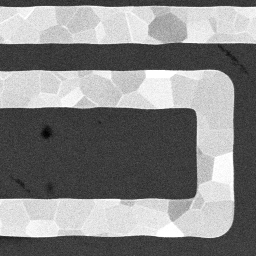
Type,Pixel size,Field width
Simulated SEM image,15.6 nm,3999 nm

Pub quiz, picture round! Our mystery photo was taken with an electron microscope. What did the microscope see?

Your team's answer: groups of lines, slits or small figures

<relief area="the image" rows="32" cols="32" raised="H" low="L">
LLLLLLLLLLLLLLLLLLLLLLLLLLLLLLLL
HHHHHHHHHHHHHHHHHHHHHHHHHHHHHHHH
HHHHHHHHHHHHHHHHHHHHHHHHHHHHHHHH
HHHHHHHHHHHHHHHHHHHHHHHHHHHHHHHH
HHHHHHHHHHHHHHHHHHHHHHHHHHHHHHHH
LLLLLLLLLLLLLLLLLLLLLLLLLLLLLLLL
LLLLLLLLLLLLLLLLLLLLLLLLLLLLLLLL
LLLLLLLLLLLLLLLLLLLLLLLLLLLLLLLL
LLLLLLLLLLLLLLLLLLLLLLLLLLLLLLLL
HHHHHHHHHHHHHHHHHHHHHHHHHHHHLLLL
HHHHHHHHHHHHHHHHHHHHHHHHHHHHHLLL
HHHHHHHHHHHHHHHHHHHHHHHHHHHHHLLL
HHHHHHHHHHHHHHHHHHHHHHHHHHHHHLLL
LLLLLLLLLLLLLLLLLHHHHLLLHHHHHLLL
LLLLLLLLLLLLLLLLLLLLLLLLLHHHHLLL
LLLLLLLLLLLLLLLLLLLLLLLLLHHHHLLL
LLLLLLLLLLLLLLLLLLLLLLLLLHHHHLLL
LLLLLLLLLLLLLLLLLLLLLLLLLHHHHLLL
LLLLLLLLLLLLLLLLLLLLLLLLLHHHHLLL
LLLLLLLLLLLLLLLLLLLLLLLLLHHHHLLL
LLLLLLLLLLLLLLLLLLLLLLLLLHHHHLLL
LLLLLLLLLLLLLLLLLLLLLLLLLHHHHLLL
LLLLLLLLLLLLLLLLLLLLLLLLLHHHHLLL
LLLLLLLLLLLLLLLLLLLLLLLLLHHHHLLL
LLLLLLLLLLLLLLLLLLLLLLLLHHHHHLLL
HHHHHHHHHHHHHHHHHHHHHHHHHHHHHLLL
HHHHHHHHHHHHHHHHHHHHHHHHHHHHHLLL
HHHHHHHHHHHHHHHHHHHHHHHHHHHHHLLL
HHHHHHHHHHHHHHHHHHHHHHHHHHHHHLLL
LLLHHHLLLLLLLLLLLLLLLLLLHHHLLLLL
LLLLLLLLLLLLLLLLLLLLLLLLLLLLLLLL
LLLLLLLLLLLLLLLLLLLLLLLLLLLLLLLL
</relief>